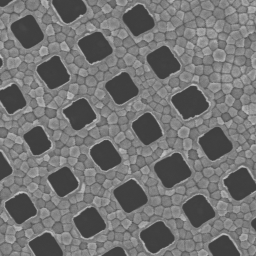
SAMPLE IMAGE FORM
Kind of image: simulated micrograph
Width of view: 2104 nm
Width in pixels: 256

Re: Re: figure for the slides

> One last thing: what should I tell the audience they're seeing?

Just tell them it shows a regular array of holes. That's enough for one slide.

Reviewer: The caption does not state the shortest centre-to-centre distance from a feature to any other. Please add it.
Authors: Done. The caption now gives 398 nanometres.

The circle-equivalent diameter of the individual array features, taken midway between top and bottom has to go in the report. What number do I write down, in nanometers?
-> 245